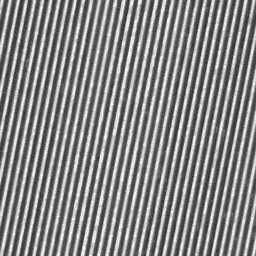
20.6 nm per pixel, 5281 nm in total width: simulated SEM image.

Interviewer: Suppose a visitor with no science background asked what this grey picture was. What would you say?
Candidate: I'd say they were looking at parallel lines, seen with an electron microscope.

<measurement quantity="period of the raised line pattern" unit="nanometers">165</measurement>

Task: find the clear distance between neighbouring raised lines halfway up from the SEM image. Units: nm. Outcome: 109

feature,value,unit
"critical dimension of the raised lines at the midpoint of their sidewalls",55.7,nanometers